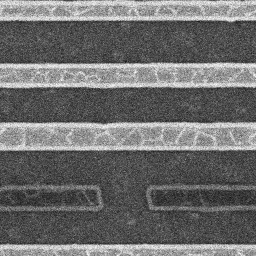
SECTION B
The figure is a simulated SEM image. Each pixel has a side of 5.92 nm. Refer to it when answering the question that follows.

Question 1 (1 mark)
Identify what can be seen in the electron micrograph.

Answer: one or a few lines or trenches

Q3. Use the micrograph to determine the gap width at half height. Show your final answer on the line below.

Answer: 238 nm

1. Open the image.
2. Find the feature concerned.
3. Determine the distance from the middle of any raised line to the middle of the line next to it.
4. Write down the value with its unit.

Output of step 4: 370 nm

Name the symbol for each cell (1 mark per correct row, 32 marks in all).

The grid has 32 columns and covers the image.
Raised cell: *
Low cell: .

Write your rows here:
********...******...*****..*****
********************************
................................
................................
................................
................................
................................
................................
********************************
********************************
********************************
................................
................................
................................
................................
................................
********************************
********************************
................................
................................
................................
................................
................................
.*.***...***.......*..*****.....
************.......*************
*************......*************
................................
................................
................................
................................
................................
********************************